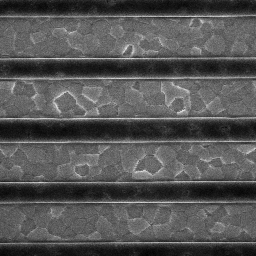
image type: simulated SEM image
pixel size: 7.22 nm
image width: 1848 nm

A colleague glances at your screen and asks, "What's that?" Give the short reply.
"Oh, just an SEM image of one or a few lines or trenches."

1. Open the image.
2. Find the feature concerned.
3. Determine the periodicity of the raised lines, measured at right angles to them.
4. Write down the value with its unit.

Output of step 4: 446 nanometers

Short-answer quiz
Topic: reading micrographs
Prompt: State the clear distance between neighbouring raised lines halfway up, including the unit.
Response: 283 nm